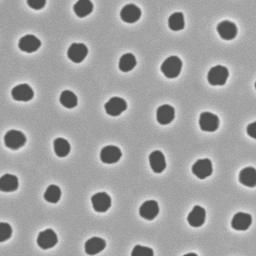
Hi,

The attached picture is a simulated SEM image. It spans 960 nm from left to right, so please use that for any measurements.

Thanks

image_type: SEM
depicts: a regular array of holes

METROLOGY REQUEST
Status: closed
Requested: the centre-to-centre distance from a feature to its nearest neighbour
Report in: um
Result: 0.172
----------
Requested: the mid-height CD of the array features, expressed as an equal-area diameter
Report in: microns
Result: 0.0751